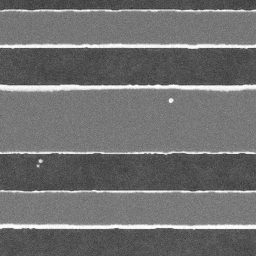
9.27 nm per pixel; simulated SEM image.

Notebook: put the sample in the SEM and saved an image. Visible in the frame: lines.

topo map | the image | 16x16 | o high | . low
................
oooooooooooooooo
oooooooooooooooo
................
................
oooooooooooooooo
oooooooooooooooo
oooooooooooooooo
oooooooooooooooo
oooooooooooooooo
................
................
oooooooooooooooo
oooooooooooooooo
................
................